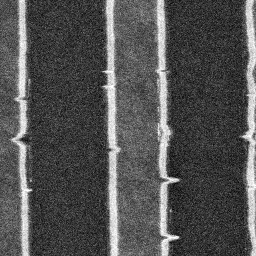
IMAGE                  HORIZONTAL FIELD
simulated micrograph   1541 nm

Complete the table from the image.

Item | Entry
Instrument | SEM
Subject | one or a few lines or trenches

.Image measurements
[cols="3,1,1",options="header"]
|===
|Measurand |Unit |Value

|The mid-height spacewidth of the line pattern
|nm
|534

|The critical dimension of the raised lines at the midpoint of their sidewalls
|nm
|306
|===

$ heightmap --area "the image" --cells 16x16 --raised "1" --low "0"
1000000111000000
1000000111000000
1000000111000000
1000000111000000
1000000111000000
1000000111000000
1000000111000000
1000000111000000
1000000111000000
1000000111000000
1000000111000000
1100000111000000
1100000111000000
1100000111000000
1100000111000000
1100000111000000